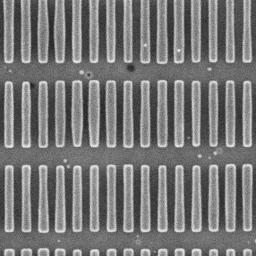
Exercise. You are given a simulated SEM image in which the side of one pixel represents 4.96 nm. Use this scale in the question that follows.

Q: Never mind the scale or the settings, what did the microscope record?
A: groups of lines, slits or small figures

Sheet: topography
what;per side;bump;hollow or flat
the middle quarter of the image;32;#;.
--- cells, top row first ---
................................
................................
................................
................................
..##..###..##..##...#...##..##..
..##..###..##..##..##...##..##..
..##..###..##..##..##...##..##..
..##..###..##..##..##...##..##..
..###.###..##..##..##...##..##..
..###.###..##..##..##...##..##..
..###.###..##..##..##..###..##..
..###.###..##..##..##..###..##..
..###.###..##..##..##..###..##..
..###.###..##..##..##..###..##..
..###.###..##..##..##..###..##..
..###.###..##..##..##..###..##..
..###.###..##..##..##..###..##..
..##..###..##..##..##..###..##..
..##...##..##..##..##..###..##..
..##...##..##..##..##...##..##..
...#...#...##..##..##...#...#...
................................
................................
................................
................................
...........##..##...#...........
..##...##..##..##..##...#...##..
..##...##..##..##..##...#...##..
..##...##..##..##..##...#...##..
..##...##..##..##..##...##..##..
..##...##..##..##..##...##..##..
..##...##..##..##..##...##..##..